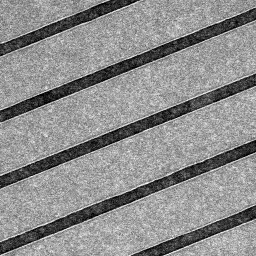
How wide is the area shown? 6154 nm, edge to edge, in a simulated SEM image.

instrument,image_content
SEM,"one or a few lines or trenches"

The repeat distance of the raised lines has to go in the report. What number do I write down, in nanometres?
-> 1470